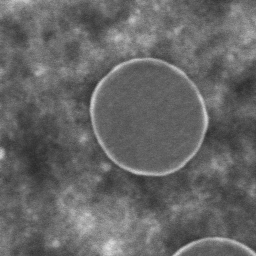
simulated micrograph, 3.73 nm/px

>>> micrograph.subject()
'raised bodies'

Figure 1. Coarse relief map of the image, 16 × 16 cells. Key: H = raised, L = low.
LLLLLLLLLLLLLLLL
LLLLLLLLLLLLLLLL
LLLLLLLLLLLLLLLL
LLLLLLLLLLLLLLLL
LLLLLLLHHHHLLLLL
LLLLLLHHHHHHLLLL
LLLLLLHHHHHHHLLL
LLLLLLHHHHHHHLLL
LLLLLLHHHHHHHLLL
LLLLLLLHHHHHLLLL
LLLLLLLLHHHLLLLL
LLLLLLLLLLLLLLLL
LLLLLLLLLLLLLLLL
LLLLLLLLLLLLLLLL
LLLLLLLLLLLLLLLL
LLLLLLLLLLLHHHHL